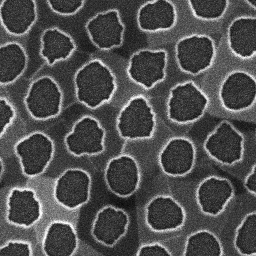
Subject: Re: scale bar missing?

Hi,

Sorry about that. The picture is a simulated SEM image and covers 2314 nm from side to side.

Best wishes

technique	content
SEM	a regular array of holes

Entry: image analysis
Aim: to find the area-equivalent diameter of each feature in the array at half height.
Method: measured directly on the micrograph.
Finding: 326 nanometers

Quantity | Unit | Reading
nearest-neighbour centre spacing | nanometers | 468